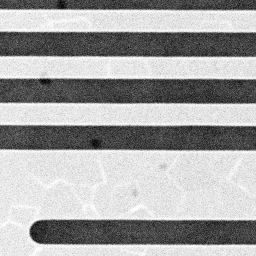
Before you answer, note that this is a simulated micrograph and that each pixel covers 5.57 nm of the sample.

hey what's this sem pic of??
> groups of lines, slits or small figures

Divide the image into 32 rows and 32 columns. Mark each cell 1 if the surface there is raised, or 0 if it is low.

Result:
00000000000000000000000000000000
11111111111111111111111111111111
11111111111111111111111111111111
11111111111111111111111111111111
00000000000000000000000000000000
00000000000000000000000000000000
00000000000000000000000000000000
11111111111111111111111111111111
11111111111111111111111111111111
11111111111111111111111111111111
00000000000000000000000000000000
00000000000000000000000000000000
00000000000000000000000000000000
11111111111111111111111111111111
11111111111111111111111111111111
11111111111111111111111111111111
00000000000000000000000000000000
00000000000000000000000000000000
00000000000000000000000000000000
11111111111111111111111111111111
11111111111111111111111111111111
11111111111111111111111111111111
11111111111111111111111111111111
11111111111111111111111111111111
11111111111111111111111111111111
11111111111111111111111111111111
11111111111111111111111111111111
11111000000000000000000000000000
11110000000000000000000000000000
11110000000000000000000000000000
11111000000000000000000000000000
11111111111111111111111111111111